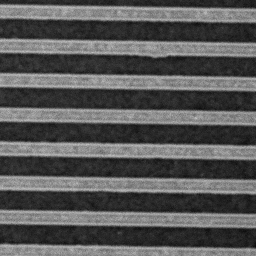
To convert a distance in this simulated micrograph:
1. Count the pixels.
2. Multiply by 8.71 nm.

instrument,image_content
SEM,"parallel lines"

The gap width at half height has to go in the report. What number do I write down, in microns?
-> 0.205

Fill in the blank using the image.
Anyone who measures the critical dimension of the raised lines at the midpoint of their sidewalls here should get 95.8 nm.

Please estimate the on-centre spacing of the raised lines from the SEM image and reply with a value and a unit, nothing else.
298 nanometres